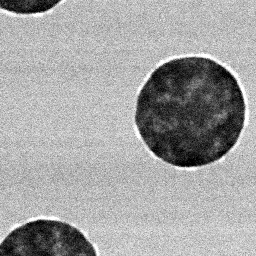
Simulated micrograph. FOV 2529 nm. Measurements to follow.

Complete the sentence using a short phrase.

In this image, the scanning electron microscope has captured holes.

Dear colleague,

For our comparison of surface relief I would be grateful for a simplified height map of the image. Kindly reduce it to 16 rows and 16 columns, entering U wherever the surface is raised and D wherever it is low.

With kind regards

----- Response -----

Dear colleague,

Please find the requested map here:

DDDUUUUUUUUUUUUU
UUUUUUUUUUUUUUUU
UUUUUUUUUUUUUUUU
UUUUUUUUUUUUUUUU
UUUUUUUUUUDDDDUU
UUUUUUUUUDDDDDDU
UUUUUUUUUDDDDDDU
UUUUUUUUDDDDDDDU
UUUUUUUUUDDDDDDU
UUUUUUUUUUDDDDUU
UUUUUUUUUUUUUUUU
UUUUUUUUUUUUUUUU
UUUUUUUUUUUUUUUU
UUUUUUUUUUUUUUUU
UDDDDUUUUUUUUUUU
DDDDDDUUUUUUUUUU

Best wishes